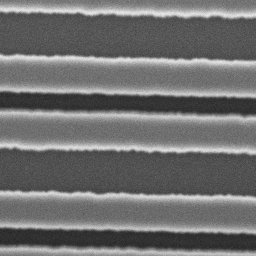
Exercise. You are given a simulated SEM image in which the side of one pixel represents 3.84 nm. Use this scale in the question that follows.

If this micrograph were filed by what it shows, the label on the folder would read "lines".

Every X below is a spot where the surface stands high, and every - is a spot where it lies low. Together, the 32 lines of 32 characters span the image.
XXXXXXXXXXXXXXXXXXXXXXXXXXXXXXXX
----------XXXXXXXXXXXXXXXXXXXXXX
--------------------------------
--------------------------------
--------------------------------
--------------------------------
--------------------------------
XXXXXXXXXXXXXXXXXXXXX---XX------
XXXXXXXXXXXXXXXXXXXXXXXXXXXXXXXX
XXXXXXXXXXXXXXXXXXXXXXXXXXXXXXXX
XXXXXXXXXXXXXXXXXXXXXXXXXXXXXXXX
-----XXXXXXXXXXXXXXXXXXXXXXXXXXX
--------------------------------
--------------------------------
XXXXXXXXXXXXXXXXXXXXXXX-X-------
XXXXXXXXXXXXXXXXXXXXXXXXXXXXXXXX
XXXXXXXXXXXXXXXXXXXXXXXXXXXXXXXX
XXXXXXXXXXXXXXXXXXXXXXXXXXXXXXXX
----XX--XXXXX-XXXXXXXXXXXXXXXXXX
--------------------------------
--------------------------------
--------------------------------
--------------------------------
--------------------------------
XXXXXXXXXXXXXXXXXXXXXXX-X-------
XXXXXXXXXXXXXXXXXXXXXXXXXXXXXXXX
XXXXXXXXXXXXXXXXXXXXXXXXXXXXXXXX
XXXXXXXXXXXXXXXXXXXXXXXXXXXXXXXX
-----XXXXXXXXXXXXXXXXXXXXXXXXXXX
--------------------------------
--------------------------------
XXXXXXXXXXXXXXXXXXXXXXX---------